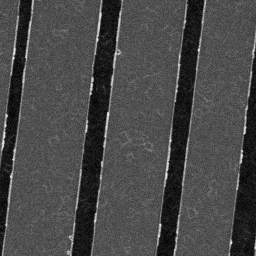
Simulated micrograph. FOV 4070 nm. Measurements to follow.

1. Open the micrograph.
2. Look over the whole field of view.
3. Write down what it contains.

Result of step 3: one or a few lines or trenches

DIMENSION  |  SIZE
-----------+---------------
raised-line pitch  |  1330 nm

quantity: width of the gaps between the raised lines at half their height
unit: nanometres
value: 1010